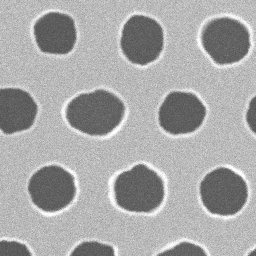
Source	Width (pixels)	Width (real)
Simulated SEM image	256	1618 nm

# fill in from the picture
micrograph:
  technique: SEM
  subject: a regular array of holes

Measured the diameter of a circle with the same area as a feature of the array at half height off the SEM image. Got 305 nanometers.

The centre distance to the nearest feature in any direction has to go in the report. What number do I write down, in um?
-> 0.533